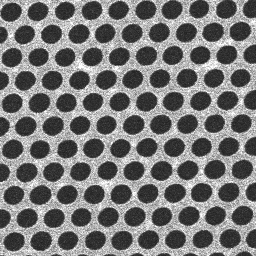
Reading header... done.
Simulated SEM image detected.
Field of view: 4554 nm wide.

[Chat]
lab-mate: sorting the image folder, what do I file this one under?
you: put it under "a regular array of holes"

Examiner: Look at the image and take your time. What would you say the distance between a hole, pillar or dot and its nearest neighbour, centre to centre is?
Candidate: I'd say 466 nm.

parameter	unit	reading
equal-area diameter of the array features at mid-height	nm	364